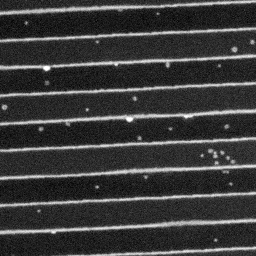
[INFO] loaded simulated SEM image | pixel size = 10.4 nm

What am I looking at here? lines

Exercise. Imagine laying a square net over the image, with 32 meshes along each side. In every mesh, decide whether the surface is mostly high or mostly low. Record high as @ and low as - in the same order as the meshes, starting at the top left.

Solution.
@@@@@@@@@@@@@@@@@@@@@@@@@@------
@@@-----------------------------
--------------------------------
--------------------------------
-------------@@@@@@@@@@@@@@@@@@@
@@@@@@@@@@@@@@@@@@@@@@@@@@@@@@@@
@@@@@@@@@@@@@@@@@@@@@@@@@@@@@@@@
@@@@@@@@@@@@@@@@@@@@@@----------
-----@--------------------------
--------------------------------
-----------------------------@@@
---------@@@@@@@@@@@@@@@@@@@@@@@
@@@@@@@@@@@@@@@@@@@@@@@@@@@@@@@@
@@@@@@@@@@@@@@@@@@@@@@@@@@@@@@@@
@@@@@@@@@@@@@@@@@---------------
--------------------------------
--------------------------------
-----------------------------@@@
-------@@@@@@@@@@@@@@@@@@@@@@@@@
@@@@@@@@@@@@@@@@@@@@@@@@@@@@@@@@
@@@@@@@@@@@@@@@@@@@@@@@@@@@@@@@@
@@@@@@@@@@@@@@@@----------------
--------------------------------
--------------------------------
-------------------------@@@@@@@
----@@@@@@@@@@@@@@@@@@@@@@@@@@@@
@@@@@@@@@@@@@@@@@@@@@@@@@@@@@@@@
@@@@@@@@@@@@@@@@@@@@@@@@@@@@@@@@
@@@@@@@@@@@@@@------------------
--------------------------------
--------------------------------
----------------------@@@@@@@@@@